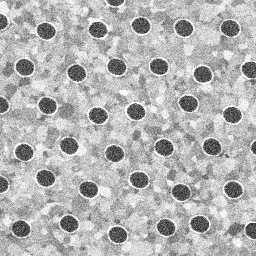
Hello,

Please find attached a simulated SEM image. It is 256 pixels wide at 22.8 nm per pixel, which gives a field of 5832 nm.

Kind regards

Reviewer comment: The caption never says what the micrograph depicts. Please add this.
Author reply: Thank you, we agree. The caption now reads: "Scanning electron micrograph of a regular array of holes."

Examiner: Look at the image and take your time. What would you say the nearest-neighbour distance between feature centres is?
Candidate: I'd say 905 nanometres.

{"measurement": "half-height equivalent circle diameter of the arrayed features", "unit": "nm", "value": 422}